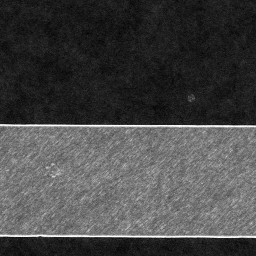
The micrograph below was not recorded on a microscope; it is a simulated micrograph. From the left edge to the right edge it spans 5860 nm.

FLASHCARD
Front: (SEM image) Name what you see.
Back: one or a few lines or trenches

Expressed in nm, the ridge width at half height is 2550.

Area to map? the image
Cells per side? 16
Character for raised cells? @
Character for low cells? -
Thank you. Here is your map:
----------------
----------------
----------------
----------------
----------------
----------------
----------------
----------------
@@@@@@@@@@@@@@@@
@@@@@@@@@@@@@@@@
@@@@@@@@@@@@@@@@
@@@@@@@@@@@@@@@@
@@@@@@@@@@@@@@@@
@@@@@@@@@@@@@@@@
@@@@@@@@@@@@@@@@
----------------